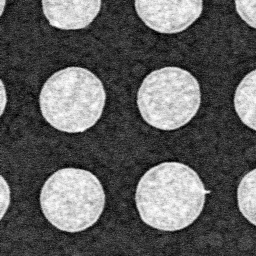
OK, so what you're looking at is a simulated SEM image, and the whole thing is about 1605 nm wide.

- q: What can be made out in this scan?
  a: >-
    raised bodies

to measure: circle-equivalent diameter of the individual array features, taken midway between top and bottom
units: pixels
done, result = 63.5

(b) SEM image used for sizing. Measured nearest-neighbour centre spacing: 610 nanometres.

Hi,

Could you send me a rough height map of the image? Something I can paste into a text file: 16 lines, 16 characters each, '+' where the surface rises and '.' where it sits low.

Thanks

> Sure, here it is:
...+++...++++..+
...++....+++....
................
................
....++....++....
...+++...+++...+
...+++...+++...+
...+++...+++...+
................
................
..........++....
...+++...++++..+
+..+++...++++..+
...+++...+++...+
................
................